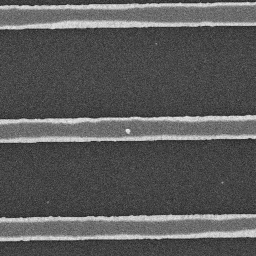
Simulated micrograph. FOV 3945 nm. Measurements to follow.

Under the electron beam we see lines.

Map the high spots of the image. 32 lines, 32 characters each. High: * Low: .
............................*.**
********************************
********************************
................................
................................
................................
................................
................................
................................
................................
................................
................................
................................
................................
................................
********************************
********************************
******.*..*...*.................
................................
................................
................................
................................
................................
................................
................................
................................
................................
********************************
********************************
************************........
................................
................................